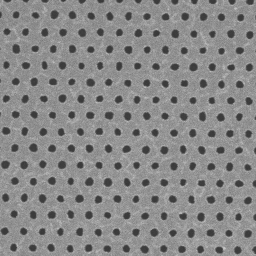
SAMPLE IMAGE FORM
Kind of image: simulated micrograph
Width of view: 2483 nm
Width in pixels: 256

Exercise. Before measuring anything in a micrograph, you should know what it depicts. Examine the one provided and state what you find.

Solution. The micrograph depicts a regular array of holes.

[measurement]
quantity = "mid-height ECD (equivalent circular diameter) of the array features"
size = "74.2 nm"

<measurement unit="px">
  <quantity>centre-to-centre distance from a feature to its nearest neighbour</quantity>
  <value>18.3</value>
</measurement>